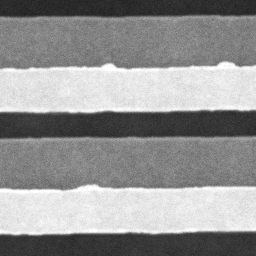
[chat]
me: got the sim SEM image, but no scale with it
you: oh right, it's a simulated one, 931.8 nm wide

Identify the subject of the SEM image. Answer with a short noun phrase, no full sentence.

lines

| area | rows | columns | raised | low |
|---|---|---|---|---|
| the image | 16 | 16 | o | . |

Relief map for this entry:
................
oooooooooooooooo
oooooooooooooooo
oooooooooooooooo
oooooooooooooooo
oooooooooooooooo
oooooooooooooooo
................
................
oooooooooooooooo
oooooooooooooooo
oooooooooooooooo
oooooooooooooooo
oooooooooooooooo
oooooooooooo....
................